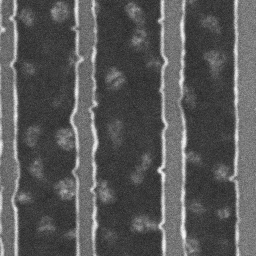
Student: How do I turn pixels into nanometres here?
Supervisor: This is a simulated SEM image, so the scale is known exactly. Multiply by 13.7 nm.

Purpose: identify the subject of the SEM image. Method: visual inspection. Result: one or a few lines or trenches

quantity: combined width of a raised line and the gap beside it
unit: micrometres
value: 1.12